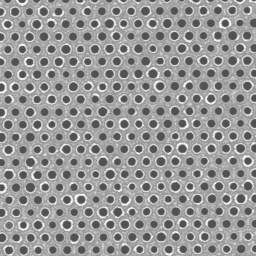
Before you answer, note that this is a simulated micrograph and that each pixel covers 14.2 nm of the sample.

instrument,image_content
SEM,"a regular array of holes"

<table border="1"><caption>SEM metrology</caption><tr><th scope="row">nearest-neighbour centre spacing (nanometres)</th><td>200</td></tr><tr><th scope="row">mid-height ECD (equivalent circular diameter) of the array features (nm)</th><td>102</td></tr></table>